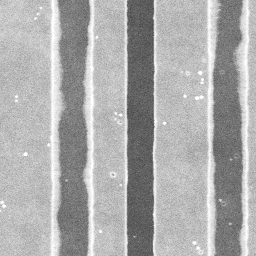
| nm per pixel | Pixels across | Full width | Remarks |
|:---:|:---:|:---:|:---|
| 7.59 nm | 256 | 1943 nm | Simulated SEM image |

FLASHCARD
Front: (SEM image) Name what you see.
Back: lines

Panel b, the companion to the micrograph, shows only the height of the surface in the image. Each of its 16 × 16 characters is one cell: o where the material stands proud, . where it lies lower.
ooo...oo..ooo..o
ooo...oo..ooo..o
ooo...oo..ooo..o
ooo...oo..ooo..o
ooo...oo..ooo..o
ooo...oo..ooo..o
ooo...oo..ooo..o
ooo...oo..ooo..o
ooo...oo..ooo..o
ooo...oo..ooo..o
ooo...oo..ooo..o
ooo...oo..ooo..o
ooo...oo..ooo..o
ooo...oo..ooo..o
ooo...oo..ooo..o
ooo...oo..ooo..o